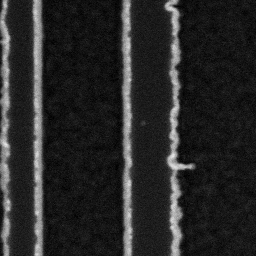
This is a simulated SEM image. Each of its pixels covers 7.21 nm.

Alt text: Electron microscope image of one or a few lines or trenches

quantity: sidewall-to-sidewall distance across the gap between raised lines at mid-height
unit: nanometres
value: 626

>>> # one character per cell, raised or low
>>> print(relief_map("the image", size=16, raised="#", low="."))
##......###.....
##......###.....
##......###.....
##......###.....
##......###.....
##......###.....
##......###.....
##......###.....
##......###.....
##......###.....
##......###.....
##......###.....
##......###.....
##......###.....
##......###.....
##......###.....